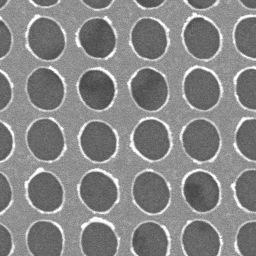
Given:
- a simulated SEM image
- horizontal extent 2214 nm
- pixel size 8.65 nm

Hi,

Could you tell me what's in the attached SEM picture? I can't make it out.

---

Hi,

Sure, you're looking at a regular array of holes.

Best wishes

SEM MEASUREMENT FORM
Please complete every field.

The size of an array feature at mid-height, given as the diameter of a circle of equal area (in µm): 0.34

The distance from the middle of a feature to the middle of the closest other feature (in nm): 437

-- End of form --